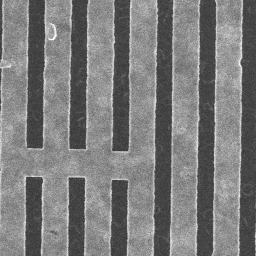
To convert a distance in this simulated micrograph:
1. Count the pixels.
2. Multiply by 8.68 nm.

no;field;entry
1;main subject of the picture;parallel lines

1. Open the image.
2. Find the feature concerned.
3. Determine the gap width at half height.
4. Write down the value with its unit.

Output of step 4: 142 nm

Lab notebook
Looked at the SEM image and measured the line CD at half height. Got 229 nm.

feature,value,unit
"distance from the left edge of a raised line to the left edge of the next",0.372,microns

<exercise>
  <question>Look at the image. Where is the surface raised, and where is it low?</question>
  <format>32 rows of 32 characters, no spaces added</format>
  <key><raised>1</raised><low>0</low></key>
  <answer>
11110011100111001111001110011100
11100011100111001111001110011100
11110011100111001111001110011100
11110011100111001111001110011100
11100011100111001111001110011100
11100011100111001111001110011100
11100011100111001111001110011100
11100011100111001111001110011100
11100011100111001111001110011100
11100111100111001110001110011100
11100011100111001110001110011100
11110111100111001111001110011100
11100111100111001110001110011100
11100111100111001110001110011100
11100111100111001110001110011100
11100111100111001110001110011100
11100111100111001110001110011100
11100111100111001110011110011100
11110111101111001110001110011100
11111111111111111110001110011100
11111111111111111110011110011100
11111111111111111110011110011100
11100111101111001110011110011100
11100111100111001110011110011100
11100111100111001110011110011100
11100111100111001110011110011100
11100111100111001110011110011100
11100111100111001110011110011100
11110111101111001110011110011100
11100111000111001110011110011100
11100111100111001110011110011100
11100111100111001110011110011100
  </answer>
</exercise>